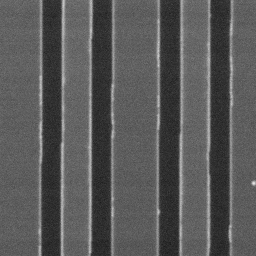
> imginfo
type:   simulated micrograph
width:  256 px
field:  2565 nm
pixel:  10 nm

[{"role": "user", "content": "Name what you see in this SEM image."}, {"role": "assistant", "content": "lines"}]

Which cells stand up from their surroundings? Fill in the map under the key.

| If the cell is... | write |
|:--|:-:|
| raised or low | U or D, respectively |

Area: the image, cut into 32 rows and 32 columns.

UUUUUDDDUUUDDDUUUUUUDDDUUUDDDUUU
UUUUUDDDUUUDDDUUUUUUDDDUUUDDDUUU
UUUUUDDDUUUDDDUUUUUUDDDUUUDDDUUU
UUUUUDDDUUUDDDUUUUUUDDDUUUDDDUUU
UUUUUDDDUUUDDDUUUUUUDDDUUUDDDUUU
UUUUUDDDUUUDDDUUUUUUDDDUUUDDDUUU
UUUUUDDDUUUDDDUUUUUUDDDUUUDDDUUU
UUUUUDDDUUUDDDUUUUUUDDDUUUDDDUUU
UUUUUDDDUUUDDDUUUUUUDDDUUUDDDUUU
UUUUUDDDUUUDDDUUUUUUDDDUUUDDDUUU
UUUUUDDDUUUDDDUUUUUUDDDUUUDDDUUU
UUUUUDDDUUUDDDUUUUUUDDDUUUDDDUUU
UUUUUDDDUUUDDDUUUUUUDDDUUUDDDUUU
UUUUUDDDUUUDDDUUUUUUDDDUUUDDDUUU
UUUUUDDDUUUDDDUUUUUUDDDUUUDDDUUU
UUUUUDDDUUUDDDUUUUUUDDDUUUDDDUUU
UUUUUDDDUUUDDDUUUUUUDDDUUUDDDUUU
UUUUUDDDUUUDDDUUUUUUDDDUUUDDDUUU
UUUUUDDDUUUDDDUUUUUUDDDUUUDDDUUU
UUUUUDDDUUUDDDUUUUUUDDDUUUDDDUUU
UUUUUDDDUUUDDDUUUUUUDDDUUUDDDUUU
UUUUUDDDUUUDDDUUUUUUDDDUUUDDDUUU
UUUUUDDDUUUDDDUUUUUUDDDUUUDDDUUU
UUUUUDDDUUUDDDUUUUUUDDDUUUDDDUUU
UUUUUDDDUUUDDDUUUUUUDDDUUUDDDUUU
UUUUUDDDUUUDDDUUUUUUDDDUUUDDDUUU
UUUUUDDDUUUDDDUUUUUUDDDUUUDDDUUU
UUUUUDDDUUUDDDUUUUUUDDDUUUDDDUUU
UUUUUDDDUUUDDDUUUUUUDDDUUUDDDUUU
UUUUUDDDUUUDDDUUUUUUDDDUUUDDDUUU
UUUUUDDDUUUDDDUUUUUUDDDUUUDDDUUU
UUUUUDDDUUUDDDUUUUUUDDDUUUDDDUUU